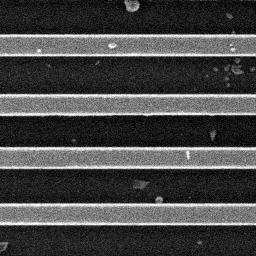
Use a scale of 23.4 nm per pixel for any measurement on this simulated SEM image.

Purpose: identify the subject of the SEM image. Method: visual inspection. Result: lines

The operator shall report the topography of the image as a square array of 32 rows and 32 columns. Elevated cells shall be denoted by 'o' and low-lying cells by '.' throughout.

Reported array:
................................
................................
................................
................................
oooooooooooooooooooooooooooooooo
oooooooooooooooooooooooooooooooo
oooooooooooooooooooooooooooooooo
................................
................................
................................
................................
................................
oooooooooooooooooooooooooooooooo
oooooooooooooooooooooooooooooooo
................................
................................
................................
................................
oooooooooooooooooooooo..ooo.....
oooooooooooooooooooooooooooooooo
oooooooooooooooooooooooooooooooo
................................
................................
................................
................................
................................
oooooooooooooooooooooooooooooooo
oooooooooooooooooooooooooooooooo
................................
................................
................................
................................